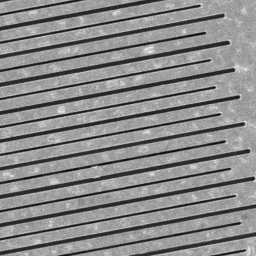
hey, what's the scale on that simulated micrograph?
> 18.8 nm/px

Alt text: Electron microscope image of parallel lines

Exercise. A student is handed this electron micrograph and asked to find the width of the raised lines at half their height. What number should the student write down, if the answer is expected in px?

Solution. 10.6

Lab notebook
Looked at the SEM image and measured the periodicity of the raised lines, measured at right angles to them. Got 259 nm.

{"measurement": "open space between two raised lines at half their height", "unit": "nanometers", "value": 66.8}